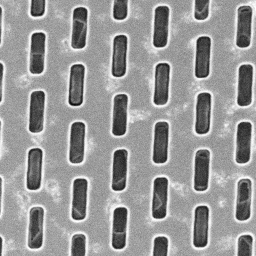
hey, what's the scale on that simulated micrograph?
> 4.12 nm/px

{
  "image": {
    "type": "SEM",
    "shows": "a regular array of holes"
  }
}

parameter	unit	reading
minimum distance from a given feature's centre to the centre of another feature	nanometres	203